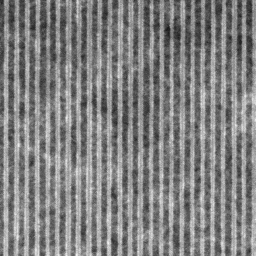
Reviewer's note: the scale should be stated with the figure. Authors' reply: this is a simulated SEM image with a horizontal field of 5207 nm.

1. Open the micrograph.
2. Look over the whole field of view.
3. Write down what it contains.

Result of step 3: parallel lines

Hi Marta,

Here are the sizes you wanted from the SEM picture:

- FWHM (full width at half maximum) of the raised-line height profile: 160 nanometres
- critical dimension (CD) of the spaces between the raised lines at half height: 2.5 pixels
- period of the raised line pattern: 210 nanometres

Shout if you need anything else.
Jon